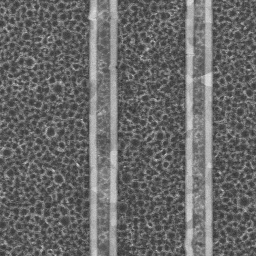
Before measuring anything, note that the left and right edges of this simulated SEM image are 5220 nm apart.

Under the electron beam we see one or a few lines or trenches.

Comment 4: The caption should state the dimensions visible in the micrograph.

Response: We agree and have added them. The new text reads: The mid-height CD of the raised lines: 0.39 micrometres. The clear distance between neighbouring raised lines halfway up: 1540 nm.